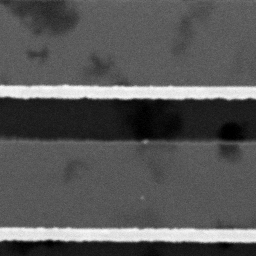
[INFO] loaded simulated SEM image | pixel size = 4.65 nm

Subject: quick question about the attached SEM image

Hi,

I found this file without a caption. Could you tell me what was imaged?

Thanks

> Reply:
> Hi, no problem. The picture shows lines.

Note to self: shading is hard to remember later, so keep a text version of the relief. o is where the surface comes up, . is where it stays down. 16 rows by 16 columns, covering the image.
oooooooooooooooo
oooooooooooooooo
oooooooooooooooo
oooooooooooooooo
oooooooooooooooo
oooooooooooooooo
................
................
................
oooooooooooooooo
oooooooooooooooo
oooooooooooooooo
oooooooooooooooo
oooooooooooooooo
oooooooooooooooo
................